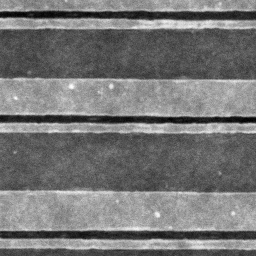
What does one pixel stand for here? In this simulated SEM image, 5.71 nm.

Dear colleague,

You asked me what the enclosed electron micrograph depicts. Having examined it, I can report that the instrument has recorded lines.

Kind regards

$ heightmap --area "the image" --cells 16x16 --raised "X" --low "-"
XXXXXXXXXXXXXXXX
XXXXXXXXXXXXXXXX
----------------
----------------
----------------
XXXXXXXXXXXXXXXX
XXXXXXXXXXXXXXXX
XXXXXXXXXXXXXXXX
----------------
----------------
----------------
----------------
XXXXXXXXXXXXXXXX
XXXXXXXXXXXXXXXX
XXXXXXXXXXXXXXXX
----XXXXXXXXXXXX